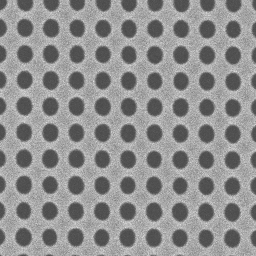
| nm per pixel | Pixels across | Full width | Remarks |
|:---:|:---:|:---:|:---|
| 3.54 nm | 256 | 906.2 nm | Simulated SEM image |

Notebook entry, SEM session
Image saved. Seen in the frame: a regular array of holes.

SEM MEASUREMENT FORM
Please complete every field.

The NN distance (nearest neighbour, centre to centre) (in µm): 0.0917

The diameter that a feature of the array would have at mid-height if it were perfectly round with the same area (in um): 0.0596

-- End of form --